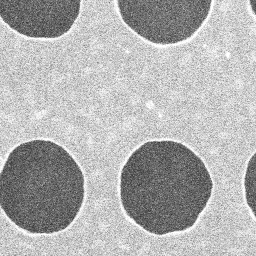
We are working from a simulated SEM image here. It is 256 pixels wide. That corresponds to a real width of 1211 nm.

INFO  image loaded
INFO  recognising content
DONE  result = holes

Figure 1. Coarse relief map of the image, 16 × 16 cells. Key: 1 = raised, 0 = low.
0000011000000111
0000011100000111
1111111110001111
1111111111111111
1111111111111111
1111111111111111
1111111111111111
1111111111111111
1111111111111111
1000111100001111
0000011100000110
0000011100000110
0000011100000110
0000011100001111
1101111110011111
1111111111111111